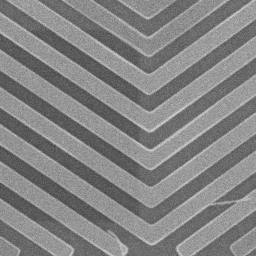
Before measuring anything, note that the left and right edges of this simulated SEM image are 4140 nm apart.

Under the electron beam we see groups of lines, slits or small figures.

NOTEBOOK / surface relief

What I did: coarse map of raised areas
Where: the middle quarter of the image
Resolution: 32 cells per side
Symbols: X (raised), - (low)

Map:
XXXX------XXXXXXXX-------XXXXXXX
XXXXX-------XXXXXXX----XXXXXXX--
XXXXXXX------XXXXXXXXXXXXXXXX---
-XXXXXXX-------XXXXXXXXXXXX-----
--XXXXXXXX------XXXXXXXXXX------
----XXXXXXX-------XXXXXXX------X
-----XXXXXXXX------XXXX------XXX
-------XXXXXXX--------------XXXX
XX------XXXXXXXX-----------XXXXX
XXX-------XXXXXXX--------XXXXXXX
XXXXX------XXXXXXXX-----XXXXXXX-
XXXXXX-------XXXXXXX---XXXXXX---
XXXXXXXX------XXXXXXXXXXXXXX----
--XXXXXXX-------XXXXXXXXXX------
----XXXXXXX------XXXXXXXX-------
-----XXXXXXX-------XXXXX-------X
-------XXXXXXX-------X-------XXX
X-------XXXXXXX-------------XXXX
XXX------XXXXXXXX----------XXXXX
XXXX-------XXXXXXX-------XXXXXX-
XXXXXX------XXXXXXXX----XXXXXX--
XXXXXXX-------XXXXXXX-XXXXXXX---
--XXXXXXX------XXXXXXXXXXXX-----
---XXXXXXX-------XXXXXXXXX------
----XXXXXXXX------XXXXXXX------X
------XXXXXXX-------XXX-------XX
X------XXXXXXXX--------------XXX
XXX------XXXXXXX-----------XXXXX
XXXX------XXXXXXXX--------XXXXXX
XXXXX-------XXXXXXX-----XXXXXXX-
XXXXXXX------XXXXXXXX--XXXXXXX--
-XXXXXXX-------XXXXXXXXXXXXX----